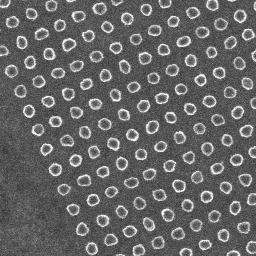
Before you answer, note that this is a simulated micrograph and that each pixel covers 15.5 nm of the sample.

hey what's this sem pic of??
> a regular array of raised bodies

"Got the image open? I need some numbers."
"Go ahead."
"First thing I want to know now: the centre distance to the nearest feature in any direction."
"0.319 microns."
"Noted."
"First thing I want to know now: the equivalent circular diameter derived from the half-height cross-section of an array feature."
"182 nm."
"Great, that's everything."